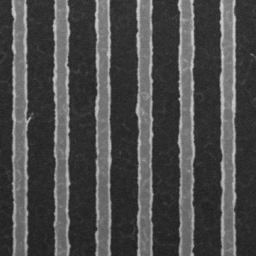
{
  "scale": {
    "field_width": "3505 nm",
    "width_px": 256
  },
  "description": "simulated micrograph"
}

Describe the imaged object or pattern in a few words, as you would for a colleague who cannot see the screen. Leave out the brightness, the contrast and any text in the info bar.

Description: parallel lines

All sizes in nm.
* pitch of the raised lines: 569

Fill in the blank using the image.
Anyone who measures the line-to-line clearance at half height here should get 399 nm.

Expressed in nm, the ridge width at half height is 174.